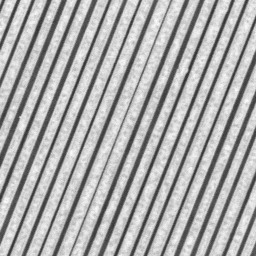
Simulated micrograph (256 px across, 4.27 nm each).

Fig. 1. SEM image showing parallel lines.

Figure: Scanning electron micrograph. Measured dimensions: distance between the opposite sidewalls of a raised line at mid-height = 38.7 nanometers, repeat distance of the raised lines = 60.8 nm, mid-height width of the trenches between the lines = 0.0223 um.